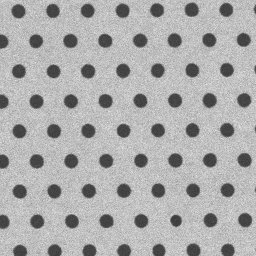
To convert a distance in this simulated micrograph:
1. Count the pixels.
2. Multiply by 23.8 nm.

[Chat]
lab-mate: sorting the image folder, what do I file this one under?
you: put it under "a regular array of holes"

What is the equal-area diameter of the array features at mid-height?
0.341 microns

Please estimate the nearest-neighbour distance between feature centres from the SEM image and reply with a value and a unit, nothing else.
0.818 µm